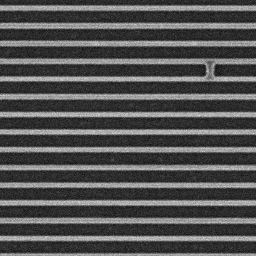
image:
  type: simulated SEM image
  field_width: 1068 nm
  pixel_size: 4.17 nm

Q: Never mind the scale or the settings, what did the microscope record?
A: parallel lines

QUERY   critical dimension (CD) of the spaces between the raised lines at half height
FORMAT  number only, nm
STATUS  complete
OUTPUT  55.8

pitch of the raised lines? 0.074 um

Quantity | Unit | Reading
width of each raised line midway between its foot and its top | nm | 15.1